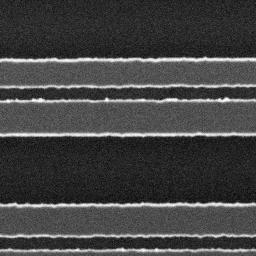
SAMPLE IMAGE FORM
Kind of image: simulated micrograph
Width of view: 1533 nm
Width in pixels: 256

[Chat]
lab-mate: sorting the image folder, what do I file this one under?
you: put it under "lines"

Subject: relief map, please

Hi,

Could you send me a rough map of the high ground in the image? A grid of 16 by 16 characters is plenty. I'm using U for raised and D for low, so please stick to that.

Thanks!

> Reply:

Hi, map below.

DDDDDDDDDDDDDDDD
DDDDDDDDDDDDDDDD
DDDDDDDDDDDDDDDD
DDDDDDDDDDDDDDDD
UUUUUUUUUUUUUUUU
UUUUUUUUUUUUUUUU
UUUUUUUUUUUUUUUU
UUUUUUUUUUUUUUUU
DDDDDDDDDDDDDDDD
DDDDDDDDDDDDDDDD
DDDDDDDDDDDDDDDD
DDDDDDDDDDDDDDDD
DDDDDDDDDDDDDDDD
UUUUUUUUUUUUUUUU
UUUUUUUUUUUUUUUU
UUUUUUUUUUUUUUUU